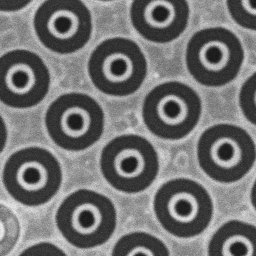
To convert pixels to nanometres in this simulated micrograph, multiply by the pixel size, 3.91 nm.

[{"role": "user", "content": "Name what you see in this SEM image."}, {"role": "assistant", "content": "a regular array of ring-shaped grooves with a dot in the middle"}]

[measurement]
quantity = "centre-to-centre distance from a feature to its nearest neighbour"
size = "270 nm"